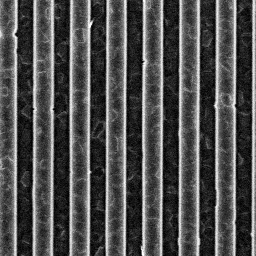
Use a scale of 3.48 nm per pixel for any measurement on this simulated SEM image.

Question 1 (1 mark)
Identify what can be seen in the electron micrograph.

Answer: parallel lines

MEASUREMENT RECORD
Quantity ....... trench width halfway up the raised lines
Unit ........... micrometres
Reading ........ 0.0645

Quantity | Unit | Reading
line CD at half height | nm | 64.5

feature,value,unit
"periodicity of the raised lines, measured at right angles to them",127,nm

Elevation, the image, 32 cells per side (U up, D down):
UUDDUUUDDUUDDUUUDDUUDDDUUDDUUDDD
UUDDUUUDDUUDDUUUDDUUDDDUUDDUUDDD
UUDDUUUDDUUDDUUUDDUUDDDUUDDUUDDD
UUDDUUUDDUUDDUUUDDUUDDDUUDDUUDDD
UUDDUUUDDUUDDUUUDDUUDDDUUDDUUDDD
UUDDUUUDDUUDDUUUDDUUDDDUUDDUUDDD
UUDDUUUDDUUDDUUUDDUUDDDUUDDUUDDD
UUDDUUUDDUUDDUUUDDUUDDDUUDDUUDDD
UUDDUUUDDUUDDUUUDDUUDDUUUDDUUDDD
UUDDUUUDDUUDDUUUDDUUDDDUUDDUUDDD
UUDDUUUDDUUDDUUUDDUUDDDUUDDUUDDD
UUDDUUUDDUUDDUUUDDUUDDDUUDDUUDDD
UUDDUUUDDUUDDUUUDDUUDDDUUDDUUDDD
UUDDUUUDDUUDDUUUDDUUDDDUUDDUUDDD
UUDDUUUDDUUDDUUUDDUUDDDUUDDUUDDD
UUDDUUUDDUUDDUUUDDUUDDDUUDDUUDDD
UUDDUUUDDUUDDUUUDDUUDDUUUDDUUDDD
UUDDUUUDDUUDDUUUDDUUDDDUUDDUUDDD
UUDDUUDDDUUDDUUUDDUUDDDUUDDUUDDD
UUDDUUDDDUUDDUUUDDUUDDDUUDDUUDDD
UUDDUUDDDUUDDUUUDDUUDDDUUDDUUDDD
UUDDUUDDDUUDDUUUDDUUDDDUUDDUUDDD
UUDDUUDDDUUDDUUUDDUUDDDUUDDUUDDD
UUDDUUDDDUUDDUUUDDUUDDDUUDDUUDDD
UUDDUUDDDUUDDUUUDDUUDDDUUDDUUDDD
UUDDUUDDDUUDDUUUDDUUDDDUUDDUUDDD
UUDDUUDDDUUDDUUUDDUUDDDUUDDUUDDD
UUDDUUDDDUUDDUUUDDUUDDDUUDDUUDDD
UUDDUUDDDUUDDUUUDDUUDDDUUDDUUDDD
UUDDUUDDDUUDDUUUDDUUDDUUUDDUUDDD
UUDDUUDDDUUDDUUUDDUUDDUUUDDUUDDD
UUDDUUDDDUUDDUUUDDUUDDDUUDDUUDDD